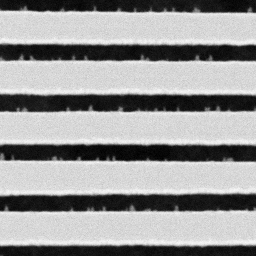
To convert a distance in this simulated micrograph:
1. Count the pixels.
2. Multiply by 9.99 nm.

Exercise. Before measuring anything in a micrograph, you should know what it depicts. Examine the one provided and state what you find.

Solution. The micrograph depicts lines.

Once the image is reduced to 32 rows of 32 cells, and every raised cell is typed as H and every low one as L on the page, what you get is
LLLLLLLLLLLLLLLLLLLLLLLLLLLLLLLL
HHHHHHHLHHHHHLLLLLLLLLLLLLLLLLLL
HHHHHHHHHHHHHHHHHHHHHHHHHHHHHHHH
HHHHHHHHHHHHHHHHHHHHHHHHHHHHHHHH
HHHHHHHHHHHHHHHHHHHHHHHHHHHHHHHH
LHLLLLLHHHHHHHHHHHHHHHHHHHHHHHHH
LLLLLLLLLLLLLLLLLLLLLLLLLLLLLLLL
LLLLLLLLLLLLLLLLLLLLLLLLLLLLLLLL
HHHHHHHHHHHHHHHHHHHHHHHHHHHHHHHH
HHHHHHHHHHHHHHHHHHHHHHHHHHHHHHHH
HHHHHHHHHHHHHHHHHHHHHHHHHHHHHHHH
HHHHHHHHHHHHHHHHHHHHHHHHHHHHHHHH
LLLLLLLLLLLLLLLLLLLLLLLLLLLLLLLL
LLLLLLLLLLLLLLLLLLLLLLLLLLLLLLLL
HHHHHHHHHHHHHHHHHHHHHHHHHHHHHHHH
HHHHHHHHHHHHHHHHHHHHHHHHHHHHHHHH
HHHHHHHHHHHHHHHHHHHHHHHHHHHHHHHH
HHHHHHHHHHHHHHHHHHHHHHHHHHHHHHHH
LLLLLLLLLLLLLLLLLLLLLLLLLLLLLLLL
LLLLLLLLLLLLLLLLLLLLLLLLLLLLLLLL
HHHHHHHHHHHHHHHHHHHHHHHHHHHHHHHH
HHHHHHHHHHHHHHHHHHHHHHHHHHHHHHHH
HHHHHHHHHHHHHHHHHHHHHHHHHHHHHHHH
HHHHHHHHHHHHHHHHHHHHHHHHHHHHHHHH
LLLLLLLLLLLLLLLLLLLLLLLLLLLLLLLL
LLLLLLLLLLLLLLLLLLLLLLLLLLLLLLLL
LLLLLLLLLLLLLLLHLLLHLLLHLHHHHHHH
HHHHHHHHHHHHHHHHHHHHHHHHHHHHHHHH
HHHHHHHHHHHHHHHHHHHHHHHHHHHHHHHH
HHHHHHHHHHHHHHHHHHHHHHHHHHHHHHHH
HHHHHHHHHHHHHHHHHHHHHHHHHHHHHHHH
LLLLLLLLLLLLLLLLLLLLLLLLLLLLLLLL